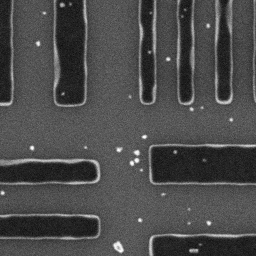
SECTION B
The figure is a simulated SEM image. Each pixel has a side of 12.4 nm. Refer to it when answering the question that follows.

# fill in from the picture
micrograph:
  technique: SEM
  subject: groups of lines, slits or small figures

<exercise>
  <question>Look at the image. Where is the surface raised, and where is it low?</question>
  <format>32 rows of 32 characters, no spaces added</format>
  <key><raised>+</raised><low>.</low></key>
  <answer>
++.....++++......++...++...++...
++.....++++......++...++...++...
+......++++......++...++...++...
+......++++.......+...++...++...
+......++++.......+...++...++...
+......++++......++...++...++...
++.....++++......++...++...++...
+......++++......++...++...++...
+......++++......++...++...++...
+......++++......++...++...++...
++.....++++.......+...++...++...
++.....++++.......+...++...++...
+......++++.......+...++...++...
................................
................................
................................
................................
................................
...................+++++++++++++
...................+++++++++++++
++++++++++++.......+++++++++++++
++++++++++++.......+++++++++++++
++++++++++++.......+++++++++++++
................................
................................
................................
................................
++++++++++++....................
++++++++++++....................
++++++++++++.......+++++++++++++
...................+++++++++++++
...................+++++++++++++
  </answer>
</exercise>